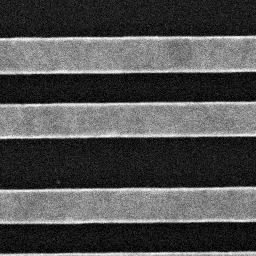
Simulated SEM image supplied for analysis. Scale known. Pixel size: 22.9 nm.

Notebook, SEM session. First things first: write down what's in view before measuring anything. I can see wiring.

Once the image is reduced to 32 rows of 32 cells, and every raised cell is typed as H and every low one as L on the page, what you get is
LLLLLLLLLLLLLLLLLLLLLLLLLLLLLLLL
LLLLLLLLLLLLLLLLLLLLLLLLLLLLLLLL
LLLLLLLLLLLLLLLLLLLLLLLLLLLLLLLL
LLLLLLLLLLLLLLLLLLLLLLLLLLLLLLLL
LLLLLLLLLLLLLLLLLLLLLLLLLLLLLLLL
HHHHHHHHHHHHHHHHHHHHHHHHHHHHHHHH
HHHHHHHHHHHHHHHHHHHHHHHHHHHHHHHH
HHHHHHHHHHHHHHHHHHHHHHHHHHHHHHHH
HHHHHHHHHHHHHHHHHHHHHHHHHHHHHHHH
LLLLLLLLLLLLLLLLLLLLLLLLLLLLLLLL
LLLLLLLLLLLLLLLLLLLLLLLLLLLLLLLL
LLLLLLLLLLLLLLLLLLLLLLLLLLLLLLLL
LLLLLLLLLLLLLLLLLLLLLLLLLLLLLLLL
HHHHHHHHHHHHHHHHHHHHHHHHHHHHHHHH
HHHHHHHHHHHHHHHHHHHHHHHHHHHHHHHH
HHHHHHHHHHHHHHHHHHHHHHHHHHHHHHHH
HHHHHHHHHHHHHHHHHHHHHHHHHHHHHHHH
LLLLLLLLLLLLLLLLLLLLLLLLLLLLLLLL
LLLLLLLLLLLLLLLLLLLLLLLLLLLLLLLL
LLLLLLLLLLLLLLLLLLLLLLLLLLLLLLLL
LLLLLLLLLLLLLLLLLLLLLLLLLLLLLLLL
LLLLLLLLLLLLLLLLLLLLLLLLLLLLLLLL
LLLLLLLLLLLLLLLLLLLLLLLLLLLLLLLL
LLLLLLLLLLLLLLLLLLLLLLLLLLLLHHHH
HHHHHHHHHHHHHHHHHHHHHHHHHHHHHHHH
HHHHHHHHHHHHHHHHHHHHHHHHHHHHHHHH
HHHHHHHHHHHHHHHHHHHHHHHHHHHHHHHH
HHHHHHHHHHHHHHHHHHHHHHHHHHHHHHHH
LLLLLLLLLLLLLLLLLLLLLLLLLLLLLLLL
LLLLLLLLLLLLLLLLLLLLLLLLLLLLLLLL
LLLLLLLLLLLLLLLLLLLLLLLLLLLLLLLL
LLLLLLLLLLLLLLLLLLLLLLLLLLLLLLLL